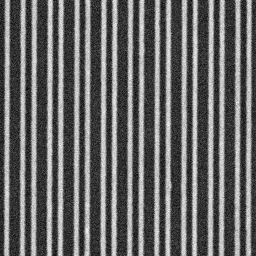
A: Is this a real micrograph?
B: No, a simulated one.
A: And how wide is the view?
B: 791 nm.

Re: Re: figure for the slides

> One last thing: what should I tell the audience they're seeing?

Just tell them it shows parallel lines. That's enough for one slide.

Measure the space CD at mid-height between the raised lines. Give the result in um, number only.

0.0312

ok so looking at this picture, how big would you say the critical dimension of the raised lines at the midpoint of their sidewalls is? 11.6 nanometres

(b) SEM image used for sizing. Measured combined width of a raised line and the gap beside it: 0.0415 micrometres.